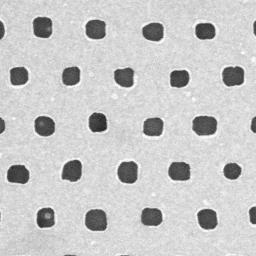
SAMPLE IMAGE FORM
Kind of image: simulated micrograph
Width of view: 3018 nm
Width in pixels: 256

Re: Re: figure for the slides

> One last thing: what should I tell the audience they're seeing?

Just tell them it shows a regular array of holes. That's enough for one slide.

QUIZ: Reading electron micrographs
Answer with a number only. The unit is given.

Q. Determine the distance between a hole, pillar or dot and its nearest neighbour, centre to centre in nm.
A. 619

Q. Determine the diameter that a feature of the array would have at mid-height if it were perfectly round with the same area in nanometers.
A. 253